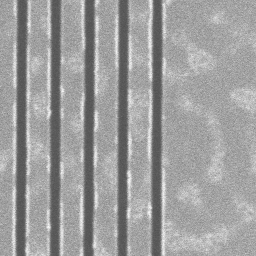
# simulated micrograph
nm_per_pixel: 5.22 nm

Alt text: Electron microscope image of parallel lines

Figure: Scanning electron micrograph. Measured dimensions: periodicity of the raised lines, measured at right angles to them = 177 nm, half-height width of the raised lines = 131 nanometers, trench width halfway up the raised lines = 48.3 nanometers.